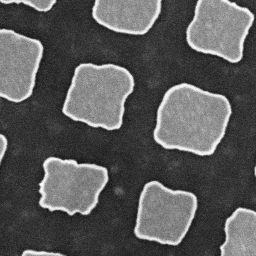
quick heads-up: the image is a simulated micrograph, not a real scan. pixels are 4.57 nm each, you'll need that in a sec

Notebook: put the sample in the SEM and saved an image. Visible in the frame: raised bodies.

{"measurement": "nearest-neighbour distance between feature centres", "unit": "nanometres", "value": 437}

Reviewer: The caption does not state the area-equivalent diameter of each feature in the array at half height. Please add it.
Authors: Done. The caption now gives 283 nm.